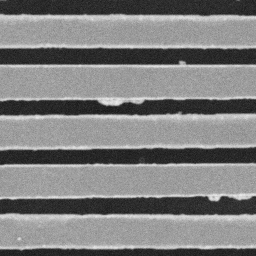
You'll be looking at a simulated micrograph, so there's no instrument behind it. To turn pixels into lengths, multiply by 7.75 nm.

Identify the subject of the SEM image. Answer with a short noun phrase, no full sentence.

lines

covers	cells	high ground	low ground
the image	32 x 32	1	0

00000000000000000000000000000000
00000000000000000000000000000000
11111111111111111111111111111111
11111111111111111111111111111111
11111111111111111111111111111111
11111111111111111111111111111111
00000000000000000000000000000000
00000000000000000000000000000000
11111111111111111111111111111111
11111111111111111111111111111111
11111111111111111111111111111111
11111111111111111111111111111111
10111000000011111100000000000000
00000000000000000000000000000000
00001011001111110011111111111111
11111111111111111111111111111111
11111111111111111111111111111111
11111111111111111111111111111111
11111111111111111111111001100000
00000000000000000000000000000000
00000000000000000000000000000000
11111111111111111111111111111111
11111111111111111111111111111111
11111111111111111111111111111111
11111111111111111111111111110110
00000000000000000000000000000000
00000000000000000000000000000000
11111111111111111111111111111111
11111111111111111111111111111111
11111111111111111111111111111111
11111111111111111111111111111111
00000000000000000000000000000000